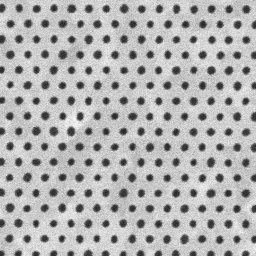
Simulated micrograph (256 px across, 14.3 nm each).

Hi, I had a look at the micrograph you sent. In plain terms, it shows a regular array of holes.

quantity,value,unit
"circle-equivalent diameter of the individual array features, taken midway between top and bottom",123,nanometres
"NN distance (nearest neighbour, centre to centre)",246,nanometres